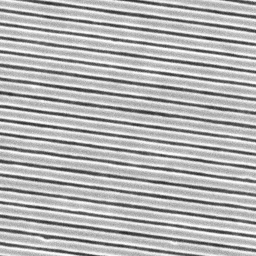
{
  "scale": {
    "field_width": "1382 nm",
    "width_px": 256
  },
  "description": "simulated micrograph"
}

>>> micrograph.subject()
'parallel lines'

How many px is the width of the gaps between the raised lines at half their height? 4.83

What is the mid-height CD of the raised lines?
47.4 nm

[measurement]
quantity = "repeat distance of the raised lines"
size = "13.6 px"